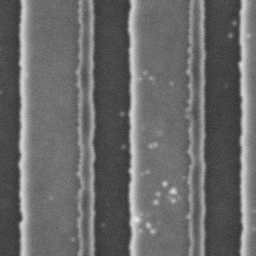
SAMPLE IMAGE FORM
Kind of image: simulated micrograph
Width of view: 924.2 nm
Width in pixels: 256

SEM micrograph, lines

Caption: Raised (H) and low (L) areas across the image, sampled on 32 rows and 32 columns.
LLLHHHHHHHHLLLLLHHHHHHHHHLLLLLHH
LLLHHHHHHHHHLLLLHHHHHHHHHLLLLLHH
LLLHHHHHHHHHLLLLHHHHHHHHHLLLLLHH
LLLHHHHHHHHHLLLLHHHHHHHHHLLLLLHH
LLLHHHHHHHHHLLLLHHHHHHHHHLLLLLHH
LLLHHHHHHHHHLLLLHHHHHHHHHLLLLLHH
LLLHHHHHHHHHLLLLHHHHHHHHHHLLLLHH
LLLHHHHHHHHLLLLLHHHHHHHHHHLLLLHH
LLLHHHHHHHHLLLLLHHHHHHHHHLLLLLHH
LLLHHHHHHHHLLLLLHHHHHHHHHLLLLLHH
LLLHHHHHHHHHLLLLHHHHHHHHHLLLLLHH
LLLHHHHHHHHLLLLLHHHHHHHHHLLLLLHH
LLLHHHHHHHHLLLLLHHHHHHHHHLLLLLHH
LLLHHHHHHHHHLLLLHHHHHHHHHLLLLLHH
LLLHHHHHHHHHLLLLHHHHHHHHHLLLLLHH
LLLHHHHHHHHHLLLLHHHHHHHHHLLLLLHH
LLLHHHHHHHHHLLLLHHHHHHHHHLLLLLHH
LLLHHHHHHHHLLLLLHHHHHHHHHLLLLLHH
LLLHHHHHHHHHLLLLHHHHHHHHHLLLLLHH
LLLHHHHHHHHHLLLLHHHHHHHHHLLLLLHH
LLLHHHHHHHHHLLLLHHHHHHHHHHLLLLHH
LLLHHHHHHHHHLLLLHHHHHHHHHLLLLLHH
LLLHHHHHHHHHLLLLHHHHHHHHHLLLLLHH
LLLHHHHHHHHHLLLLHHHHHHHHHLLLLLHH
LLLHHHHHHHHHLLLLHHHHHHHHHLLLLLHH
LLLHHHHHHHHHLLLLHHHHHHHHHLLLLLHH
LLLHHHHHHHHHLLLLHHHHHHHHHHLLLLHH
LLLHHHHHHHHHLLLLHHHHHHHHHLLLLLHH
LLLHHHHHHHHHLLLLHHHHHHHHHLLLLLHH
LLLHHHHHHHHHLLLLLHHHHHHHHLLLLLHH
LLLHHHHHHHHHLLLLHHHHHHHHHLLLLLHH
LLLHHHHHHHHHLLLLHHHHHHHHHLLLLLHH